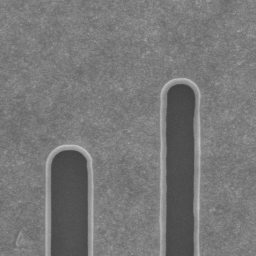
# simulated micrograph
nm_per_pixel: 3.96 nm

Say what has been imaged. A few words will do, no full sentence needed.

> one or a few lines or trenches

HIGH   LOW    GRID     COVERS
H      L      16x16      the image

HHHHHHHHHHHHHHHH
HHHHHHHHHHHHHHHH
HHHHHHHHHHHHHHHH
HHHHHHHHHHHHHHHH
HHHHHHHHHHHHHHHH
HHHHHHHHHHLLHHHH
HHHHHHHHHHLLHHHH
HHHHHHHHHHLLHHHH
HHHHHHHHHHLLHHHH
HHHHLHHHHHLLHHHH
HHHLLLHHHHLLHHHH
HHHLLLHHHHLLHHHH
HHHLLLHHHHLLHHHH
HHHLLLHHHHLLHHHH
HHHLLLHHHHLLHHHH
HHHLLLHHHHLLHHHH